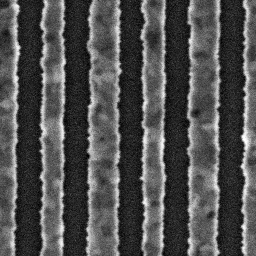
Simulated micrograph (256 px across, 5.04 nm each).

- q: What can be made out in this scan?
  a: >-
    lines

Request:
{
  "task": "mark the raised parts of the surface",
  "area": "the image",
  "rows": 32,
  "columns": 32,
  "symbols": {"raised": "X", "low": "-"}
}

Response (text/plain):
XX----XX---XXXX---XXX---XXX---XX
XX---XXX---XXXX---XXX---XXX----X
XX---XXX---XXXX---XXX---XXX----X
XX---XXX---XXXX---XX----XXX----X
XX---XXX---XXXX---XXX---XXX----X
XX---XXX---XXXX---XXX---XXX----X
XX---XXX---XXXX---XXX---XXX---XX
XX---XXX---XXXX---XX----XXX---XX
XX---XXX---XXXX---XX----XXX---XX
XX---XXX---XXXX---XXX---XXX----X
XX---XXX---XXXX---XXX---XXX----X
XX---XXX---XXXX---XXX---XXX----X
XX---XXX---XXXX---XX----XXX----X
XX---XXX---XXXX---XX----XXX----X
XX---XXX---XXXX---XX---XXXX----X
XX---XXX---XXXX---XX----XXX----X
XX---XXX---XXXX---XX----XXX---XX
XX---XXX---XXXX---XX----XXX---XX
XX---XXX---XXXX---XX----XXX----X
XX---XXX---XXXX---XX----XXX---XX
XX---XXX---XXXX---XX----XXX---XX
XX---XXX---XXXX---XX----XXX---XX
XX---XXX---XXXX---XXX---XXX----X
XX---XXX---XXXX---XX----XXX----X
XX---XXX---XXXX---XX----XXX---XX
XX---XXX---XXXX---XX----XXX---XX
XX---XXX---XXXX---XX----XXX---XX
XX---XXX---XXXX---XX----XXX---XX
XX---XXX---XXXX---XX----XXX---XX
XX---XXX---XXXX---XX----XXX---XX
XX---XXX---XXXX---XX----XXX---XX
XX---XXX---XXXX---XX----XXX---XX